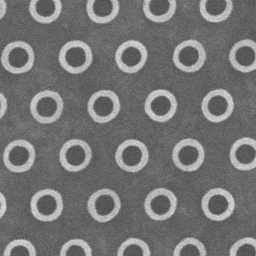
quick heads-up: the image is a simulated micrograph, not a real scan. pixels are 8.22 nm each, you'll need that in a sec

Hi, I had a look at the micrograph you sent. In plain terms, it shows a regular array of ring-shaped raised bodies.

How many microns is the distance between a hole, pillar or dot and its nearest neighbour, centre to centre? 0.462